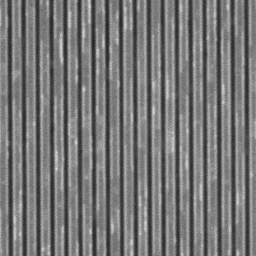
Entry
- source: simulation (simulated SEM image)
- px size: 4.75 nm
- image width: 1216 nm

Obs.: parallel lines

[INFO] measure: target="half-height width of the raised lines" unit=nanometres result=41.5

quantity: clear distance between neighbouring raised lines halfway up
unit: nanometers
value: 24.9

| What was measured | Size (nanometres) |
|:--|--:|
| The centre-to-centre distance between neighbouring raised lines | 66.1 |